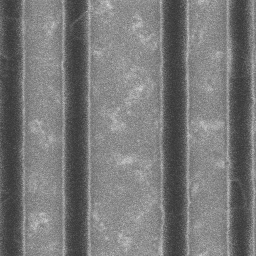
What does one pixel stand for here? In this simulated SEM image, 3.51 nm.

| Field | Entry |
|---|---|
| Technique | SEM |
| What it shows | one or a few lines or trenches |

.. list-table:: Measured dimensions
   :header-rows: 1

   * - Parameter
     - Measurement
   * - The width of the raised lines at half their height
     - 94.4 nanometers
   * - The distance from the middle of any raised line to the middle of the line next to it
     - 286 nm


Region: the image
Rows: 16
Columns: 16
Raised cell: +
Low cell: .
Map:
+...++....++..++
+...++....++..++
+...++....++..++
+...++....++..++
+...++....++..++
+...++....++..++
+...++....++..++
++..++....++..++
+...++....++..++
+...++....++..++
+...++....++..++
+...++....++..++
+...++....++..++
++..++....++..++
++..++....++..++
++..++....++..++